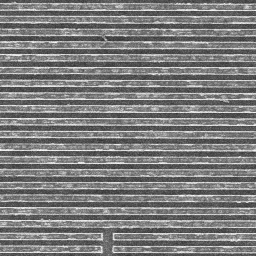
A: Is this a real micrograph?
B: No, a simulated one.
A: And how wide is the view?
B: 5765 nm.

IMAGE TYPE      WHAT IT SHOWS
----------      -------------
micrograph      parallel lines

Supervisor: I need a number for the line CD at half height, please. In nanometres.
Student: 144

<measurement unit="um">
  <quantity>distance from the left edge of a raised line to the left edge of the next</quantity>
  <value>0.287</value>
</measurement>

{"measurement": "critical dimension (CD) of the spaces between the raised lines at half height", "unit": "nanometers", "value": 144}